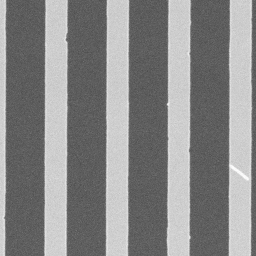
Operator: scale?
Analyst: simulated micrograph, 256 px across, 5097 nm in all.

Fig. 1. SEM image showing parallel lines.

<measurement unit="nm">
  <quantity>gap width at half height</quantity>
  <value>801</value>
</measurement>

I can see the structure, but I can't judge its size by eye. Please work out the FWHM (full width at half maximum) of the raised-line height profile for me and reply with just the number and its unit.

0.423 microns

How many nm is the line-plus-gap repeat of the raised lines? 1220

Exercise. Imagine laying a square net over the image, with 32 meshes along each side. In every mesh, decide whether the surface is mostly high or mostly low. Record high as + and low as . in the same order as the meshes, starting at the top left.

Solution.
+.....++.....+++.....+++.....++.
+.....++.....+++.....+++.....++.
+.....++.....+++.....+++.....++.
+.....++.....+++.....+++.....++.
+.....++.....+++.....+++.....++.
+.....++.....+++.....+++.....++.
+.....++.....+++.....+++.....++.
+.....++.....+++.....+++.....++.
+.....++.....+++.....+++.....++.
+.....++.....+++.....+++.....++.
+.....++.....+++.....+++.....++.
+.....++.....+++.....+++.....++.
+.....++.....+++.....+++.....++.
+.....++.....+++.....+++.....++.
+.....++.....+++.....+++.....++.
+.....++.....+++.....+++.....++.
+.....++.....+++.....+++.....++.
+.....++.....+++.....+++.....++.
+.....++.....+++.....+++.....++.
+.....++.....+++.....+++.....++.
+.....++.....+++.....+++.....++.
+.....++.....+++.....+++.....++.
+.....++.....+++.....+++.....++.
+.....++.....+++.....+++.....++.
+.....++.....+++.....+++.....++.
+.....++.....+++.....+++.....++.
+.....++.....+++.....+++.....++.
+.....++.....+++.....+++.....++.
+.....++.....+++.....+++.....++.
+.....++.....+++.....+++.....++.
+.....++.....+++.....+++.....++.
......++.....+++.....+++.....++.